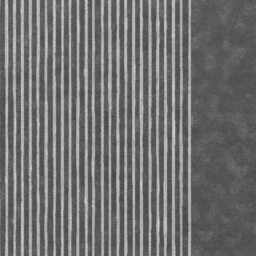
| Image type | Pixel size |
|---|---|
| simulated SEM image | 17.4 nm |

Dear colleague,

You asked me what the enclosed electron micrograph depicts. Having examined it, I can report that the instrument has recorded parallel lines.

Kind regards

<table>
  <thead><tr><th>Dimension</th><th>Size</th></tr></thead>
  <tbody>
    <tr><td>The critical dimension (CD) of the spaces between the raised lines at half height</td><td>109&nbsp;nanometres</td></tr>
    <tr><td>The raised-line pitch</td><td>138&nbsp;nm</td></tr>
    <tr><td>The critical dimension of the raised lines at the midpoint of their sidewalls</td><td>0.0305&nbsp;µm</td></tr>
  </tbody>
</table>